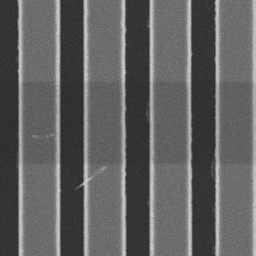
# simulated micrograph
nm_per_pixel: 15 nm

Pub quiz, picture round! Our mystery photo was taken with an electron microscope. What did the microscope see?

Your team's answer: lines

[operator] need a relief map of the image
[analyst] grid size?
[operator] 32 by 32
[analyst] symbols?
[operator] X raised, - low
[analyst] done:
--XXXXX----XXXXX---XXXXX---XXXXX
--XXXXX----XXXXX---XXXXX---XXXXX
--XXXXX----XXXXX---XXXXX---XXXXX
--XXXXX----XXXXX---XXXXX---XXXXX
--XXXXX----XXXXX---XXXXX---XXXXX
--XXXXX----XXXXX---XXXXX---XXXXX
--XXXXX----XXXXX---XXXXX---XXXXX
--XXXXX----XXXXX---XXXXX---XXXXX
--XXXXX----XXXXX---XXXXX---XXXXX
--XXXXX----XXXXX---XXXXX---XXXXX
--XXXXX----XXXXX---XXXXX---XXXXX
--XXXXX----XXXXX---XXXXX---XXXXX
--XXXXX----XXXXX---XXXXX---XXXXX
--XXXXX----XXXXX---XXXXX---XXXXX
--XXXXX----XXXXX---XXXXX---XXXXX
--XXXXX----XXXXX---XXXXX---XXXXX
--XXXXX----XXXXX---XXXXX---XXXXX
--XXXXX----XXXXX---XXXXX---XXXXX
--XXXXX----XXXXX---XXXXX---XXXXX
--XXXXX----XXXXX---XXXXX---XXXXX
--XXXXX----XXXXX---XXXXX---XXXXX
--XXXXX----XXXXX---XXXXX---XXXXX
--XXXXX---XXXXXX---XXXXX---XXXXX
--XXXXX---XXXXXX---XXXXX---XXXXX
--XXXXX----XXXXX---XXXXX---XXXXX
--XXXXX----XXXXX---XXXXX---XXXXX
--XXXXX----XXXXX---XXXXX---XXXXX
--XXXXX----XXXXX---XXXXX---XXXXX
--XXXXX----XXXXX---XXXXX---XXXXX
--XXXXX----XXXXX---XXXXX---XXXXX
--XXXXX----XXXXX---XXXXX---XXXXX
--XXXXX----XXXXX---XXXXX---XXXXX